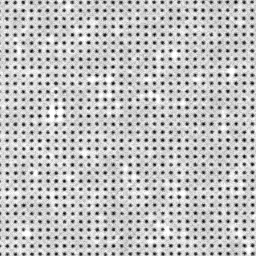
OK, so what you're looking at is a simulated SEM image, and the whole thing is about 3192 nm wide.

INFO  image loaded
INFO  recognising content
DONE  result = a regular array of holes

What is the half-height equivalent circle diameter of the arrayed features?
46.7 nm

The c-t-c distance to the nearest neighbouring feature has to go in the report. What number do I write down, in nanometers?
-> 98.1